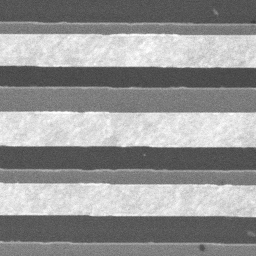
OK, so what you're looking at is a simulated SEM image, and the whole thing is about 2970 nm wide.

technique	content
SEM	lines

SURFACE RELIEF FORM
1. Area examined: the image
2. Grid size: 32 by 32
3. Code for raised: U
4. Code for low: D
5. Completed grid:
DDDDDDDDDDDDDDDDDDDDDDDDDDDDDDDD
DDDDDDDDDDDDDDDDDDDDDDDDDDDDDDDD
DDDDDDDDDDDDDDDDDDDDDDDDDDDDDDDD
UUUUUUUUUUUUUUUUUUUUUUUUUUUUUUUU
UUUUUUUUUUUUUUUUUUUUUUUUUUUUUUUU
UUUUUUUUUUUUUUUUUUUUUUUUUUUUUUUU
UUUUUUUUUUUUUUUUUUUUUUUUUUUUUUUU
UUUUUUUUUUUUUUUUUUUUUUUUUUUUUUUU
DDDDDDDDDDDDDDDDDDDDDDDDDDDDDDDD
DDDDDDDDDDDDDDDDDDDDDDDDDDDDDDDD
DDDDDDDDDDDDDDDDDDDDDDDDDDDDDDDD
UUUUUUUUUUUUUUUUUUUUUUUUUUUUUUUU
UUUUUUUUUUUUUUUUUUUUUUUUUUUUUUUU
UUUUUUUUUUUUUUUUUUUUUUUUUUUUUUUU
UUUUUUUUUUUUUUUUUUUUUUUUUUUUUUUU
UUUUUUUUUUUUUUUUUUUUUUUUUUUUUUUU
UUUUUUUUUUUUUUUUUUUUUUUUUUUUUUUU
UUUUUUUUUUUUUUUUUUUUUUUUUUUUUUUU
DDDDDDDDDDDDDDDDDDDDDDDDDDDDDDDD
DDDDDDDDDDDDDDDDDDDDDDDDDDDDDDDD
DDDDDDDDDDDDDDDDDDDDDDDDDDDDDDDD
UUUUUUUUUUUUUUUUUUUUUUUUUUUUUUUU
UUUUUUUUUUUUUUUUUUUUUUUUUUUUUUUU
UUUUUUUUUUUUUUUUUUUUUUUUUUUUUUUU
UUUUUUUUUUUUUUUUUUUUUUUUUUUUUUUU
UUUUUUUUUUUUUUUUUUUUUUUUUUUUUUUU
UUUUUUUUUUUUUUUUUUUUUUUUUUUUUUUU
DDDDDDDDDDDDDDDDDDDDDDDDDDDDDDDD
DDDDDDDDDDDDDDDDDDDDDDDDDDDDDDDD
DDDDDDDDDDDDDDDDDDDDDDDDDDDDDDDD
UUUUUUUUUUUUUUUUUUUUUUUUUUUDDDDD
UUUUUUUUUUUUUUUUUUUUUUUUUUUUUUUU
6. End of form